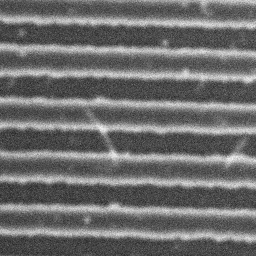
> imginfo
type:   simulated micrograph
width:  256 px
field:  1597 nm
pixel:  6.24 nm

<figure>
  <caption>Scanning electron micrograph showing lines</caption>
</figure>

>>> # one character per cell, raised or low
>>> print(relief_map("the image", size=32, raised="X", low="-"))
XXXXXXXXXXXXXXXXXXXXXXXXXXXXXXXX
XXXXXXXXXXXXXXXXXXXXXXXXXXXXXXXX
XXXXXXXXXXXXXXXXXXXXXXXXXXXXXXXX
--------------------------------
--------------------------------
--------------------------------
XXXXXXXXXXXXXXXXXXXXXXXXXXXXXX--
XXXXXXXXXXXXXXXXXXXXXXXXXXXXXXXX
XXXXXXXXXXXXXXXXXXXXXXXXXXXXXXXX
------XX----XXXXXXXXXXXXXXXXXXXX
--------------------------------
--------------------------------
XXXXXX--XX--X-------------------
XXXXXXXXXXXXXXXXXXXXXXXXXXXXXXXX
XXXXXXXXXXXXXXXXXXXXXXXXXXXXXXXX
XXXXXXXXXXXXXXXXXXXXXXXXXXXXXXXX
--------------------X----XXXXXXX
--------------------------------
--------------------------------
XXXXXXXXXXXXXXXX---X-X----------
XXXXXXXXXXXXXXXXXXXXXXXXXXXXXXXX
XXXXXXXXXXXXXXXXXXXXXXXXXXXXXXXX
XXXXXXXXXXXXXXXXXXXXXXXXXXXXXXXX
--------------------------------
--------------------------------
--------------------------------
XXXXXXXXXXXXXXXXXXXXXXXXXXXXXXXX
XXXXXXXXXXXXXXXXXXXXXXXXXXXXXXXX
XXXXXXXXXXXXXXXXXXXXXXXXXXXXXXXX
--------------X--XXXXXXXXXXXXXXX
--------------------------------
--------------------------------